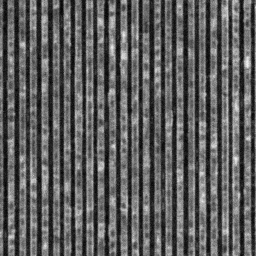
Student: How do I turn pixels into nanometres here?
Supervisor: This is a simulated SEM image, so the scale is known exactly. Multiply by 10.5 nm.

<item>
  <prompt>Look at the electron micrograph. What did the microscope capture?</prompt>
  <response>parallel lines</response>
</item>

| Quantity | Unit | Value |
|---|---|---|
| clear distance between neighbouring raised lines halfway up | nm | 56.6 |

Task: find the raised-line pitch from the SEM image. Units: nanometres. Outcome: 119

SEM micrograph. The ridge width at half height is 65.8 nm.